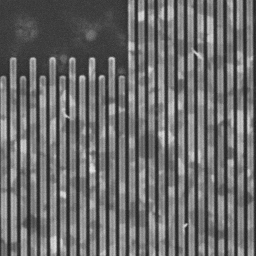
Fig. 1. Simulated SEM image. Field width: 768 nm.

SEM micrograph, parallel lines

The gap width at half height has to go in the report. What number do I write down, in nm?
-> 16.1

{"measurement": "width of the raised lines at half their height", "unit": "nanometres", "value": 13.9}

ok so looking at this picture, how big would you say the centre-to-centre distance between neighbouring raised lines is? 29.6 nm